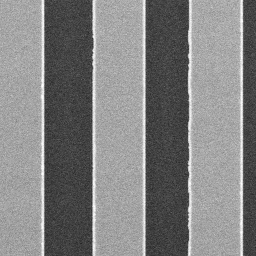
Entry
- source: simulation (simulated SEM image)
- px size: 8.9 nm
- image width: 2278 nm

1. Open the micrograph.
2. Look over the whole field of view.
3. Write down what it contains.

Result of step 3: lines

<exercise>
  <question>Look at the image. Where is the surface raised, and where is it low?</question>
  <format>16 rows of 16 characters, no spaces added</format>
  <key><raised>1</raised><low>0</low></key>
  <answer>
1110001110001110
1110001110001110
1110001110001110
1110001110001110
1110001110001110
1110001110001110
1110001110001110
1110001110001110
1110001110001110
1110001110001110
1110001110001110
1110001110001110
1110001110001110
1110001110001110
1110001110001110
1110001110001110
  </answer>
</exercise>